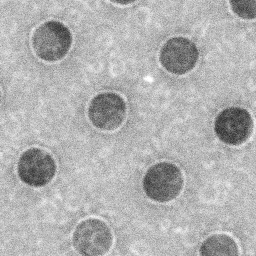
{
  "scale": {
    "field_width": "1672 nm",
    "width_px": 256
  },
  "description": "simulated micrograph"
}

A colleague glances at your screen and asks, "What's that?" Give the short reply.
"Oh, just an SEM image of raised bodies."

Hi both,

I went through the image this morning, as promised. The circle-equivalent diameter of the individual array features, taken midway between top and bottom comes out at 0.274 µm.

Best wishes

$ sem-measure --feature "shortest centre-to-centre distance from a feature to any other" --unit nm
589